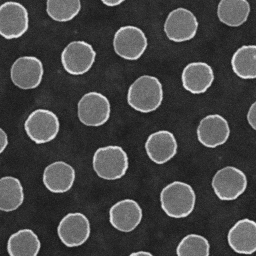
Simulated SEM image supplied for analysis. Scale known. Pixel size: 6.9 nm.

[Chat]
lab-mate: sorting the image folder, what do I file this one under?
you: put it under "a regular array of raised bodies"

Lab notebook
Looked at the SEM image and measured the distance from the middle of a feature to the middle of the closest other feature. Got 0.37 microns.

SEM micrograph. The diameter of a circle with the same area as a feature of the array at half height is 226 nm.